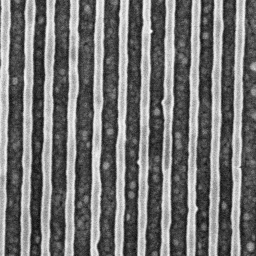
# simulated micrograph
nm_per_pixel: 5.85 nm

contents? parallel lines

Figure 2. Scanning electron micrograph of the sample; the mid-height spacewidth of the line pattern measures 89.9 nm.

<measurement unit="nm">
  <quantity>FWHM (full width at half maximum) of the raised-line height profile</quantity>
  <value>45.3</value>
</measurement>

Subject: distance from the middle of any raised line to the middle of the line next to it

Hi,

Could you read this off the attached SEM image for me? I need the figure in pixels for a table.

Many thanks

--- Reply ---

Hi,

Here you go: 23.4